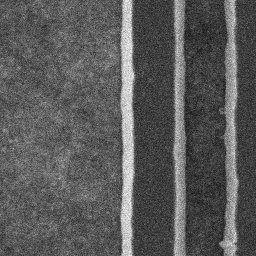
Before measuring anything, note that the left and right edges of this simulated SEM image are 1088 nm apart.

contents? one or a few lines or trenches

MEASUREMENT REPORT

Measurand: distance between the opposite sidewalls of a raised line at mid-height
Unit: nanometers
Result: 221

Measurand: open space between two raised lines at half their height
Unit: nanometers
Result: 214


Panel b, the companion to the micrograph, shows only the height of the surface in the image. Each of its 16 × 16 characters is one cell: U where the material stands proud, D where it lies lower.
DDDDDDDDUUUDDDUU
DDDDDDDDUUUDDDUU
DDDDDDDDUUUDDDUU
DDDDDDDDUUUDDDUU
DDDDDDDDUUUDDDUU
DDDDDDDDUUUDDDUU
DDDDDDDDUUUDDDUU
DDDDDDDDUUUDDDUU
DDDDDDDDUUUDDDUU
DDDDDDDDUUUDDDUU
DDDDDDDDUUUDDDUU
DDDDDDDDUUUDDDUU
DDDDDDDDUUUDDDUU
DDDDDDDDUUUDDDUU
DDDDDDDDUUUDDDUU
DDDDDDDDUUUDDDUU